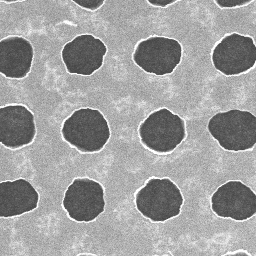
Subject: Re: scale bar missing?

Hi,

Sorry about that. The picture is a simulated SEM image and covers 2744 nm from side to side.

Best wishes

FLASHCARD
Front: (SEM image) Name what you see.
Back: holes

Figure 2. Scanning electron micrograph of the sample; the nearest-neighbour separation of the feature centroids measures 755 nm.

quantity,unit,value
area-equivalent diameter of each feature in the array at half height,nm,453